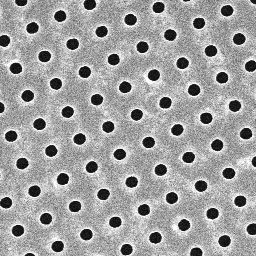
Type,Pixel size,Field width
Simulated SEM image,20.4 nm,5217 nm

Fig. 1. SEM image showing a regular array of holes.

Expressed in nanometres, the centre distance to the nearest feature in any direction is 607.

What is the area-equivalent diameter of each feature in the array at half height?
12.4 px